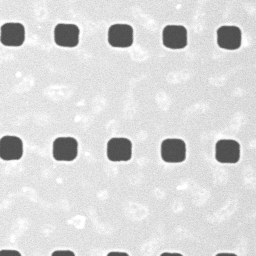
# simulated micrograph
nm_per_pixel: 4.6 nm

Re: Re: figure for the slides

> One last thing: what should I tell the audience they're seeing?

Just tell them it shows a regular array of holes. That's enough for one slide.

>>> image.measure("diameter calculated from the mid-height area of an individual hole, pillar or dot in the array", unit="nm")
123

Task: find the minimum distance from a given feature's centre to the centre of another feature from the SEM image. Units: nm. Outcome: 249